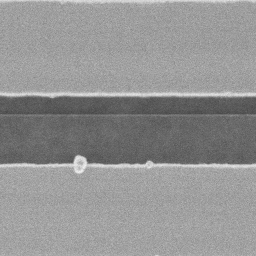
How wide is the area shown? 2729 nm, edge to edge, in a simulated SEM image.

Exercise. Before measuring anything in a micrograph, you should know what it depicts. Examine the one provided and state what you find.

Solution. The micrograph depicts lines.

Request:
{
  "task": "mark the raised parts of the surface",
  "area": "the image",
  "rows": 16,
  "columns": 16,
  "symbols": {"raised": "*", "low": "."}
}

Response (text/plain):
****************
****************
****************
****************
****************
****************
................
................
................
................
****************
****************
****************
****************
****************
****************